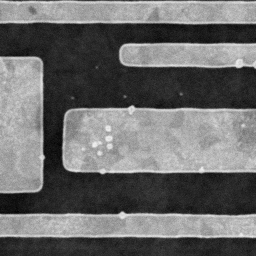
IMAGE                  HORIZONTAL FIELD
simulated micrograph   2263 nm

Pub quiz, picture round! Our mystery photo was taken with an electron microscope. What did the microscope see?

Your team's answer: wiring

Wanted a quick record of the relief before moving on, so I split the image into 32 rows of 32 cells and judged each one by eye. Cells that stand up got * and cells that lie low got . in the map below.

********************************
********************************
********************************
................................
................................
...................*****...***.*
...............*****************
*****..........*****************
*****...........................
*****...........................
*****...........................
*****...........................
*****...........................
*****...........*...............
*****...************************
*****...************************
*****...************************
*****...************************
*****...************************
*****...************************
*****...************************
*****.......**...........*......
*****...........................
*****...........................
................................
................................
................................
********************************
********************************
*.***.**********.***************
................................
................................